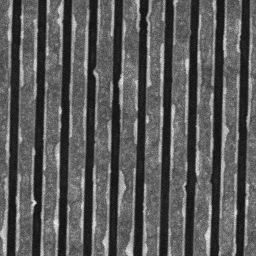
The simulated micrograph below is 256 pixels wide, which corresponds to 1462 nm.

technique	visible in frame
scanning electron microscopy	parallel lines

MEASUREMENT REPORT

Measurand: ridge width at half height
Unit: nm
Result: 93.6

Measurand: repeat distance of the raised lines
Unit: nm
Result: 145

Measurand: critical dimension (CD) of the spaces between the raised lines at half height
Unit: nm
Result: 52.1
